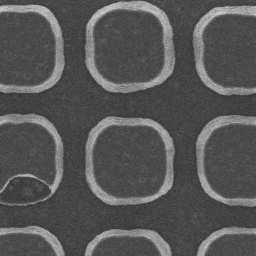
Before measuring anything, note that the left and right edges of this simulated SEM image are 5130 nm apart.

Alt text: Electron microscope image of raised bodies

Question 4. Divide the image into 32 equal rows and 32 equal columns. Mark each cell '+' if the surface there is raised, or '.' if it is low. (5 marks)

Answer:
................................
++++++.......+++++++........++++
+++++++.....++++++++......++++++
+++++++....++++++++++....+++++++
+++++++....++++++++++....+++++++
++++++++...++++++++++....+++++++
++++++++...++++++++++....+++++++
++++++++...++++++++++....+++++++
+++++++....++++++++++....+++++++
+++++++.....++++++++.....+++++++
++++++.......++++++.......++++++
............................++++
................................
................................
................................
++++++.......++++++........+++++
+++++++.....++++++++......++++++
+++++++.....+++++++++....+++++++
+++++++....++++++++++....+++++++
+++++++....++++++++++....+++++++
+++++++....++++++++++....+++++++
+++++++....++++++++++....+++++++
+....++....++++++++++....+++++++
+...........+++++++++.....++++++
.............+++++++.......+++++
................................
................................
................................
................................
++++++.......++++++........+++++
+++++++.....++++++++......++++++
++++++++...++++++++++....+++++++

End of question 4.